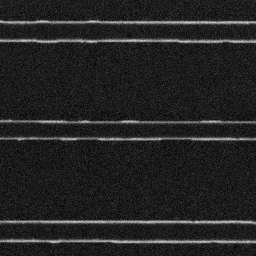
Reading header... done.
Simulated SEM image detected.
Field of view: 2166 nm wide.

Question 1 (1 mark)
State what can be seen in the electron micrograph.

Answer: lines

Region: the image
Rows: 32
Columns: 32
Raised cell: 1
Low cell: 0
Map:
00000000000000000000000000000000
00000000000000000000000000000000
00000000000000000000000000000000
11111111111111111111111111111111
11111111111111111111111111111111
00000000000000000000000000000000
00000000000000000000000000000000
00000000000000000000000000000000
00000000000000000000000000000000
00000000000000000000000000000000
00000000000000000000000000000000
00000000000000000000000000000000
00000000000000000000000000000000
00000000000000000000000000000000
00000000000000000000000000000000
11111111111111111111111111111111
11111111111111111111111111111111
00000000000000000000000000000000
00000000000000000000000000000000
00000000000000000000000000000000
00000000000000000000000000000000
00000000000000000000000000000000
00000000000000000000000000000000
00000000000000000000000000000000
00000000000000000000000000000000
00000000000000000000000000000000
00000000000000000000000000000000
00000000000000000000000000000000
11111111111111111111111111111111
11111111111111111111111111111111
00000000000000000000000000000000
00000000000000000000000000000000